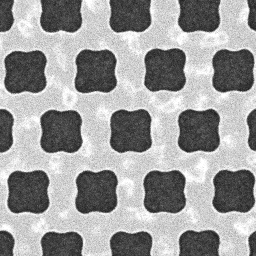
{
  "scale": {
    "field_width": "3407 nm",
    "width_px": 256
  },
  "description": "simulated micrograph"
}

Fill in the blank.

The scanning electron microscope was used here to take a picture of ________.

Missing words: a regular array of holes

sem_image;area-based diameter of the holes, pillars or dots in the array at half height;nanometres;618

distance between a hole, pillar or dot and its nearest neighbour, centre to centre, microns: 0.909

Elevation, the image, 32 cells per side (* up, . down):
..***.....****.....***......***.
..***.....****.....***.....****.
..***.....****.....***......***.
.****.....****....*****....****.
********************************
********************************
*....*****....****.....****....*
*.....***......***.....****.....
*.....****.....***.....****.....
*.....***......***.....****.....
*.....***......***.....****.....
*....*****....*****.*******.****
********************************
********************************
..***.....****.....***.....****.
..***.....****.....***.....****.
..***.....****.....***.....****.
..***.....****.....***......***.
.****.....****.....***.....****.
********************************
********************************
**....****....*****....****....*
*.....***......***.....****.....
*.....****.....***.....****.....
*.....****.....***.....****.....
*.....***......***.....****.....
*.....****....*****...*****..*.*
********************************
********************************
..***.....****.....****....****.
..***.....****.....***......***.
..***.....****.....***.....****.